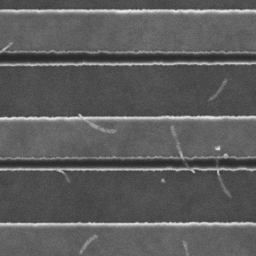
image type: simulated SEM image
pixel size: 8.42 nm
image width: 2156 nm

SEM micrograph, lines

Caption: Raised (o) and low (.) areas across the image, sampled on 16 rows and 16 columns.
................
oooooooooooooooo
oooooooooooooooo
oooooooooooooooo
................
................
................
oooooooooooooooo
oooooooooooooooo
oooooooooooooooo
oooooooooooooooo
................
................
................
oooooooooooooooo
oooooooooooooooo